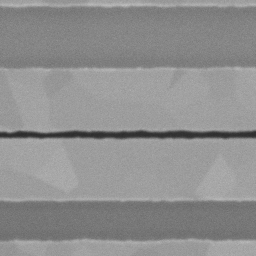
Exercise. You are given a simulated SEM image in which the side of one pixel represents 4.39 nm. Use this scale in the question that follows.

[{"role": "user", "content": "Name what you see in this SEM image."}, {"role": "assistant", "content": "lines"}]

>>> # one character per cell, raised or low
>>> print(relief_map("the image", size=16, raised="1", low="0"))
0000000000000000
0000000000000000
0000000000000000
0000000000000000
1111111111111111
1111111111111111
1111111111111111
1111111111111111
1111111111111111
1111111111111111
1111111111111111
1111111111111111
1101000101100010
0000000000000000
0000000000000000
1111111111111111